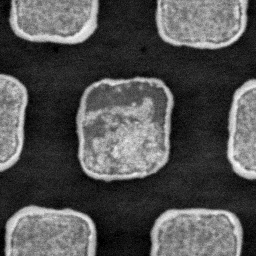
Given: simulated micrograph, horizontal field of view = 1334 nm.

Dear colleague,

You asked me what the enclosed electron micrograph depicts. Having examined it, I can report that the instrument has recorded raised bodies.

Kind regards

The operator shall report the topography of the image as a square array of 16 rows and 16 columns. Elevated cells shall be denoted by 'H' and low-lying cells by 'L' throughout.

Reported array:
LHHHHHLLLLHHHHHL
LHHHHHLLLLHHHHHL
LLLHHLLLLLLHHHHL
LLLLLLLLLLLLLLLL
LLLLLLLLLLLLLLLL
HLLLLLLLLLLLLLLH
HHLLLLLLLLLLLLLH
HLLLLLLLLLLLLLLH
HLLLLLLLLLLLLLHH
HLLLLLLLLLLLLLHH
LLLLLLLLLLLLLLLH
LLLLLLLLLLLLLLLL
LLLLLLLLLLLLLLLL
LHHHHLLLLLHHHHLL
HHHHHHLLLLHHHHHL
HHHHHHLLLLHHHHHL